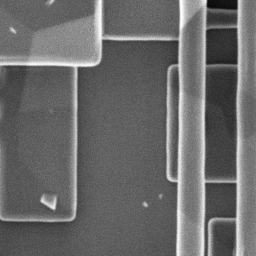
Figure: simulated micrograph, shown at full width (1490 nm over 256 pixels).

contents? wiring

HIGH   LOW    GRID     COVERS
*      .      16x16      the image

******.....**..*
******.....**..*
******.....**..*
******.....**..*
...........**..*
...........**..*
...........**..*
...........**..*
...........**..*
...........**..*
...........**..*
...........**..*
...........**..*
...........**..*
...........**..*
...........**..*